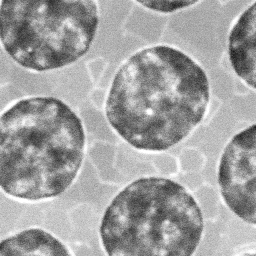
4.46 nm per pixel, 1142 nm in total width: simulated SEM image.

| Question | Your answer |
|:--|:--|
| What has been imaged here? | holes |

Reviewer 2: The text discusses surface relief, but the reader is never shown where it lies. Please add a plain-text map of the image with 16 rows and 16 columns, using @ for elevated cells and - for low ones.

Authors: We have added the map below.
------@@@--@@@@@
------@@@@@@@@@-
------@@@@@@@@--
@----@@@----@@--
@@@@@@@------@@-
@@@@@@@------@@@
@---@@@------@@@
-----@@------@@@
-----@@@----@@@-
-----@@@@@@@@@--
-----@@@@@@@@@--
----@@@@---@@@--
@--@@@@-----@@--
@@@@@@-------@@-
@--@@@-------@@@
----@@------@@@@